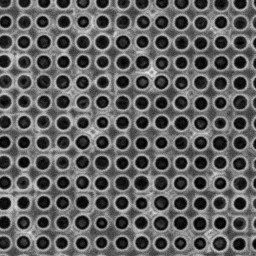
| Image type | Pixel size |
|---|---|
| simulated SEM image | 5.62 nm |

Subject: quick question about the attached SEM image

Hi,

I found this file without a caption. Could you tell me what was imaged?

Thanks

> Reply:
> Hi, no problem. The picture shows a regular array of holes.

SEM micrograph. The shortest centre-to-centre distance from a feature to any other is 108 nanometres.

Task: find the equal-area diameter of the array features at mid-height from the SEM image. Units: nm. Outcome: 78.7